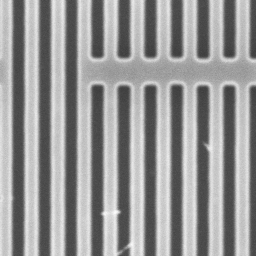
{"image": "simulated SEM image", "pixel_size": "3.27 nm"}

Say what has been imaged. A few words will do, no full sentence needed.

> parallel lines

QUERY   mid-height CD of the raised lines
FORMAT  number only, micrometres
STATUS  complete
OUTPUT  0.0401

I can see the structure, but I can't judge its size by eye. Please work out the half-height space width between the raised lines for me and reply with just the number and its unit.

0.0462 micrometres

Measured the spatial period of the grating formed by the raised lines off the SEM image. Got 86.4 nanometres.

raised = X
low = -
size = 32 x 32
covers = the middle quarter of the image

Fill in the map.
----XXXXXXXXXXXXXXXXXXXXXXXXXXXX
----XXXXXXXXXXXXXXXXXXXXXXXXXXXX
----XXXXXXXXXXXXXXXXXXXXXXXXXXXX
----XXXXXXXXXXXXXXXXXXXXXXXXXXXX
----XXXXXXXXXXXXXXXXXXXXXXXXXXXX
----XXX---XXX----XXX---XXX----XX
----XX----XXX----XXX---XXX----XX
----XXX---XXX----XXX---XXX----XX
----XXX---XXX----XXX---XXX----XX
----XXX---XXX----XXX---XXX----XX
----XXX---XXX----XXX---XXX----XX
----XX----XXX----XXX---XXX----XX
----XX----XXX----XXX---XXX----XX
----XX----XXX----XXX---XXX----XX
----XX----XXX----XXX----XX----XX
----XX----XXX----XXX---XXX----XX
----XX----XXX----XXX---XXX----XX
----XX----XXX----XXX---XXX----XX
----XX----XXX----XXX---XXX----XX
----XX----XXX----XXX---XXX----XX
----XX----XXX----XXX---XXX----XX
----XXX---XXX----XXX---XXX----XX
----XX----XXX----XXX---XXX----XX
----XX----XXX----XXX---XXX----XX
----XX----XXX----XXX---XXX----XX
----XX----XXX----XXX---XXX----XX
----XX----XXX----XXX---XXX----XX
----XXX---XXX----XXX---XXX----XX
----XX----XXX----XXX---XXX----XX
----XX----XXX----XXX---XXX----XX
----XX----XXX----XXX---XXX----XX
----XX----XXX----XXX---XXX----XX